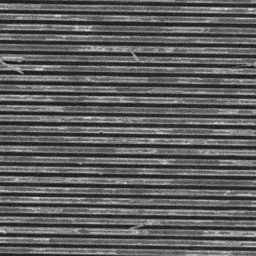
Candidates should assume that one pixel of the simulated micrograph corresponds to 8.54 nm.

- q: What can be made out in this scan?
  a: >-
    parallel lines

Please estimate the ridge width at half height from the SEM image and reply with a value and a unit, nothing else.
41.6 nanometers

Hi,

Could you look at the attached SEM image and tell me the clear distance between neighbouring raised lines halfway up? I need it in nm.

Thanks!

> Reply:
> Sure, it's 41.6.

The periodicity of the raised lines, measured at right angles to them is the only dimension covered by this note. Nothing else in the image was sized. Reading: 86.6 nanometres